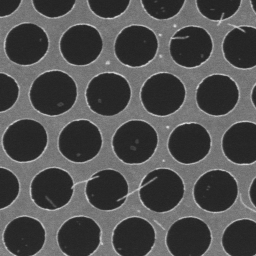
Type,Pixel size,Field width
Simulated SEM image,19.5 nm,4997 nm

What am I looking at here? a regular array of holes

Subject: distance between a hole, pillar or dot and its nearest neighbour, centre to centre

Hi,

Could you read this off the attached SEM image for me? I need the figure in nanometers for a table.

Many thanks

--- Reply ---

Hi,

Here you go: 1070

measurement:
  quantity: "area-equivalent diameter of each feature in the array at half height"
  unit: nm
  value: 840